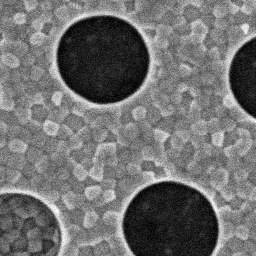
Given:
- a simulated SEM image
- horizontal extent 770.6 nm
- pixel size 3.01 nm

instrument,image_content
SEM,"holes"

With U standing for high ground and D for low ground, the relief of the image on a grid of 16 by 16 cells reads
UUUUUUUUUUUUUUUU
UUUUUDDDUUUUUUUU
UUUUDDDDDUUUUUUU
UUUUDDDDDUUUUUUD
UUUUDDDDDUUUUUDD
UUUUDDDDDUUUUUDD
UUUUUUDUUUUUUUUD
UUUUUUUUUUUUUUUU
UUUUUUUUUUUUUUUU
UUUUUUUUUUUUUUUU
UUUUUUUUUUUUUUUU
UUUUUUUUUUDDUUUU
DDUUUUUUDDDDDUUU
DDDUUUUUDDDDDDUU
DDDDUUUUDDDDDDUU
DDDDUUUUDDDDDUUU